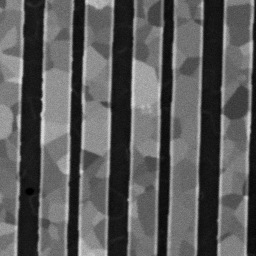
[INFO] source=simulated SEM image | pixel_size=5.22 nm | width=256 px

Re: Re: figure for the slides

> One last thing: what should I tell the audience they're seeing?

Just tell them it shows parallel lines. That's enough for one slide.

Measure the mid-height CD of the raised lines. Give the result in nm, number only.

144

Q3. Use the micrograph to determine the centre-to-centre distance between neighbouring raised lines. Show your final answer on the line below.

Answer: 234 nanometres